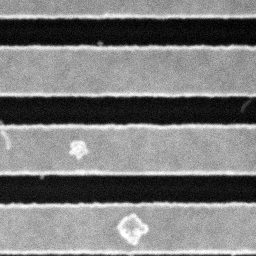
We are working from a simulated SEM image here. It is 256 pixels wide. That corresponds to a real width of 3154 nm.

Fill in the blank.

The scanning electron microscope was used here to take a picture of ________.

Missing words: lines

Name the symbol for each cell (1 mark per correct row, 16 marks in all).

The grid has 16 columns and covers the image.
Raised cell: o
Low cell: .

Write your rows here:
oooooooooooooooo
................
................
oooooooooooooooo
oooooooooooooooo
oooooooooooooooo
................
................
oooooooooooooooo
oooooooooooooooo
oooooooooooooooo
................
................
oooooooooooooooo
oooooooooooooooo
oooooooooooooooo